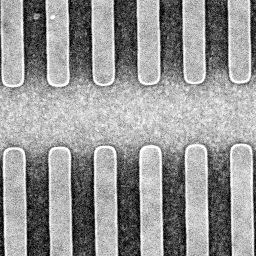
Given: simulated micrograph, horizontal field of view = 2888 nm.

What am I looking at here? groups of lines, slits or small figures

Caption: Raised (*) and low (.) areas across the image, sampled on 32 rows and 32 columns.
***...**....**...***...***...**.
***...***...**...***...***...**.
***...***...**...***...***...**.
***...***...**...***...***...**.
***...***...**...***...***...**.
***...***...**...***...***...**.
***...***...**...***...***...**.
***...***...**...***...***...**.
***...***...**...***...***...**.
***...***...**...***...***...**.
.**....*....**....*.............
................................
................................
................................
................................
................................
................................
................................
............**....**....*....**.
.**...***...**....**...***...**.
.**...***...**....**...***...**.
.**...***...**....**...***...**.
.**...***...**....**...***...**.
.**...***...**....**...***...**.
.**...***...**....**...***...**.
.**...***...**....**...***...**.
.**...***...***...**...***...***
.**...***...***...**...***...***
.**...***...***...**...***...***
.**...***...***...**...***...***
.**...***...***...**...***...***
.**...***...***...**...***...***